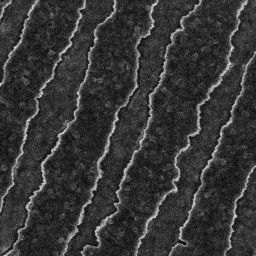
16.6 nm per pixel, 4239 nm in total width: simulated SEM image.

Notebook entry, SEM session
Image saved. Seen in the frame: one or a few lines or trenches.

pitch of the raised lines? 1220 nm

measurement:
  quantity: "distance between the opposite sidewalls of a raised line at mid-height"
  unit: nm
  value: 795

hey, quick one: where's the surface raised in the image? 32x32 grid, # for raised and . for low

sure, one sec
#...#######...######.....######.
....######....#####.....######..
...#######...######....#######..
...#######..#######....#######..
...######...######...########...
..#######...#####....########...
.#######...######....########...
.######....######....########..#
.######....######...########...#
#######....######...########..##
######....#######...#######...##
#####.....#######..#######....##
#####.....######...#######....##
#####.....#####....######....###
####.....######....######....###
###......#####....#######...####
###.....######....#######...####
###....#######....######...#####
###....######....######....#####
###...#######....#####.....#####
##...#######....######....######
##...#######....######...######.
##...#######...#######...######.
#....#######...#######...######.
#...########...######...######..
....#######....#####....#####...
...#######....######....#####...
...#######...######....######...
...#######..######.....######...
..#######...######....#######...
..#######...######....#######...
.#######..#######....#######....